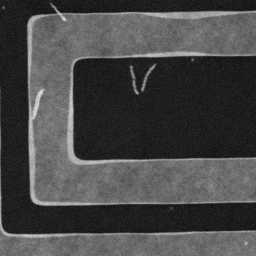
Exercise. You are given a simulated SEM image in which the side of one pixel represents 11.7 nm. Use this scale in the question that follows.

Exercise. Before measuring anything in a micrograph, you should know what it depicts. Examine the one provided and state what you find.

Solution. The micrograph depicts groups of lines, slits or small figures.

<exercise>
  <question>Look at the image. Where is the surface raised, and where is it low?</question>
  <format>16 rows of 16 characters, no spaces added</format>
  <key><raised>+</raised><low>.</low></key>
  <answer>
................
..++++++++++++++
..++++++++++++++
..+++++++.......
..+++...........
..++............
..++............
..++............
..++............
..++............
..++++++++++++++
..++++++++++++++
..++++++++++++++
................
..............++
++++++++++++++++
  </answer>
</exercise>